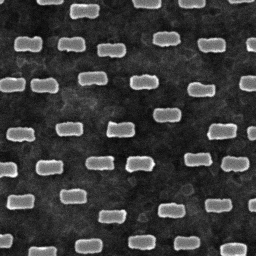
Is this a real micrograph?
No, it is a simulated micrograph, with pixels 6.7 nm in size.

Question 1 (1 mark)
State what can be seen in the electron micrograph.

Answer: a regular array of raised bodies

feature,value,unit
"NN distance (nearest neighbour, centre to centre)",260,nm